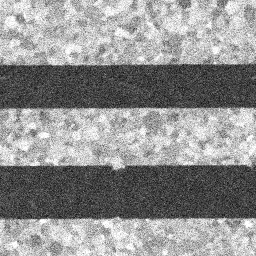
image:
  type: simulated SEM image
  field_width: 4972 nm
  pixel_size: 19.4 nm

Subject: one or a few lines or trenches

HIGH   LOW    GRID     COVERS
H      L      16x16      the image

HHHHHHHHHHHHHHHH
HHHHHHHHHHHHHHHH
HHHHHHHHHHHHHHHH
HHHHHHHHHHHHHHHH
LLLLLLLLLLLLLLLL
LLLLLLLLLLLLLLLL
LLLLLLLLLLLLLLLL
HHHHHHHHHHHHHHHH
HHHHHHHHHHHHHHHH
HHHHHHHHHHHHHHHH
LLLLLLLLLLLLLLLL
LLLLLLLLLLLLLLLL
LLLLLLLLLLLLLLLL
LLLLLLLLLLLLLLLL
HHHHHHHHHHHHHHHH
HHHHHHHHHHHHHHHH